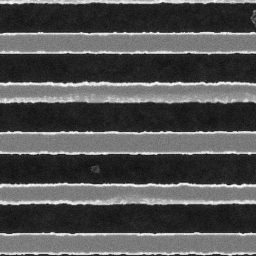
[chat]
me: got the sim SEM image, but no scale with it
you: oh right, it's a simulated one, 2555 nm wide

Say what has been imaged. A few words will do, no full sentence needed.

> lines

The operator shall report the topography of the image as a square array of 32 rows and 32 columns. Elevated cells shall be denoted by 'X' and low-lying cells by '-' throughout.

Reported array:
--------------------------------
--------------------------------
--------------------------------
--------------------------------
XXXXXXXXXXXXXXXXXXXXXXXXXXXXXXXX
XXXXXXXXXXXXXXXXXXXXXXXXXXXXXXXX
XXXXXXXXXXXXXXXXXXXXXXXXXXXXXXXX
--------------------------------
--------------------------------
--------------------------------
XXXXXXXXXXXXXXXXXXXXXXXXXXXXXXXX
XXXXXXXXXXXXXXXXXXXXXXXXXXXXXXXX
XXXXXXXXXXXXXXXXXXXXXXXX-XXXXX-X
--------------------------------
--------------------------------
--------------------------------
-XX----XXXXX-XX---X-XX--XXXXXXXX
XXXXXXXXXXXXXXXXXXXXXXXXXXXXXXXX
XXXXXXXXXXXXXXXXXXXXXXXXXXXXXXXX
--------------------------------
--------------------------------
--------------------------------
--------------------------------
XXXXXXXXXXXXXXXXXXXXXXXXXXXXXXXX
XXXXXXXXXXXXXXXXXXXXXXXXXXXXXXXX
--------------------------------
--------------------------------
--------------------------------
--------------------------------
XXXXXXXXXXXXXXXXXXXXXXXXXXXXXXXX
XXXXXXXXXXXXXXXXXXXXXXXXXXXXXXXX
XXXXXXXXXXXXXXXXXXXXXXXXXXXXXXXX